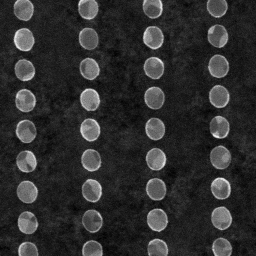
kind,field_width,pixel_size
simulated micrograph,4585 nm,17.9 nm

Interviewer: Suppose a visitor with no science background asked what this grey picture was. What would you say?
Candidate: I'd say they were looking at a regular array of raised bodies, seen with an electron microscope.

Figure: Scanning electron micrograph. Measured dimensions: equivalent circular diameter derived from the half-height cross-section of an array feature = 371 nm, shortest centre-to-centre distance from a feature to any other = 542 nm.